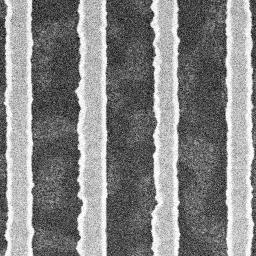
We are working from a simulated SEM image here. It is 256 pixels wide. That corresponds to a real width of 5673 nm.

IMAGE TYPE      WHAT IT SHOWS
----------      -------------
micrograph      one or a few lines or trenches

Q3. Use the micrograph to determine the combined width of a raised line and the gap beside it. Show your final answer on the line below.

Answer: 73.5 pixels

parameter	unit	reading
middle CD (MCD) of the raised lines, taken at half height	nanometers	468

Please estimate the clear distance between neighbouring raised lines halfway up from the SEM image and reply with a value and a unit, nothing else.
1170 nanometers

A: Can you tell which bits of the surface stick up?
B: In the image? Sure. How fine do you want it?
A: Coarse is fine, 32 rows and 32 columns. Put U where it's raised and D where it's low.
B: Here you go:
DUUUDDDDDDUUUDDDDDDUUUDDDDDDDUUD
DUUUDDDDDDUUUDDDDDDUUUDDDDDDDUUD
DUUUDDDDDDUUUDDDDDDUUUDDDDDDDUUD
DUUUDDDDDDUUUDDDDDDUUUDDDDDDDUUD
DUUUDDDDDDUUUDDDDDDDUUDDDDDDDUUD
DUUUDDDDDDUUUDDDDDDUUUDDDDDDDUUD
DUUUDDDDDDUUUDDDDDDDUUDDDDDDDUUD
DUUUDDDDDDUUUDDDDDDDUUDDDDDDDUUD
DUUUDDDDDDUUUDDDDDDDUUDDDDDDDUUD
DUUUDDDDDDUUUDDDDDDUUUDDDDDDDUUD
DUUUDDDDDDUUUDDDDDDDUUDDDDDDDUUD
DUUUDDDDDDUUUDDDDDDDUUDDDDDDDUUD
DUUUDDDDDDUUUDDDDDDDUUDDDDDDDUUD
DUUUDDDDDDUUUDDDDDDDUUDDDDDDDUUD
DUUUDDDDDDUUUDDDDDDDUUDDDDDDDUUD
DUUUDDDDDDUUUDDDDDDDUUDDDDDDDUUD
DUUUDDDDDDUUUDDDDDDDUUDDDDDDDUUD
DUUUDDDDDDUUUDDDDDDDUUDDDDDDDUUD
DUUUDDDDDDUUUDDDDDDDUUDDDDDDDUUD
DUUUDDDDDDUUUDDDDDDUUUDDDDDDDUUD
DUUUDDDDDDUUUDDDDDDDUUDDDDDDDUUD
DUUUDDDDDDUUUDDDDDDDUUDDDDDDDUUD
DUUUDDDDDDUUUDDDDDDUUUDDDDDDDUUD
DUUUDDDDDDUUUDDDDDDDUUDDDDDDDUUD
DUUUDDDDDDUUUDDDDDDDUUDDDDDDDUUD
DUUUDDDDDDDUUDDDDDDDUUDDDDDDDUUD
DUUUDDDDDDUUUDDDDDDUUUDDDDDDDUUD
DUUUDDDDDDUUUDDDDDDUUUDDDDDDDUUD
DUUUDDDDDDUUUDDDDDDUUUDDDDDDDUUD
DUUUDDDDDDUUUDDDDDDUUUDDDDDDDUUD
DUUUDDDDDDUUUDDDDDDUUUDDDDDDDUUD
DUUUDDDDDDUUUDDDDDDUUUDDDDDDDUUD